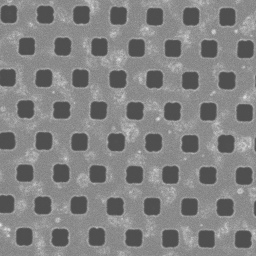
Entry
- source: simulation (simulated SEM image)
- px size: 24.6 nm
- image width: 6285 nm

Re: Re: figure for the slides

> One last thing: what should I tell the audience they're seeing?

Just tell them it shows a regular array of holes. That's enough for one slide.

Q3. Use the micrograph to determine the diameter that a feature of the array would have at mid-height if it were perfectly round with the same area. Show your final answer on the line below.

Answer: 0.469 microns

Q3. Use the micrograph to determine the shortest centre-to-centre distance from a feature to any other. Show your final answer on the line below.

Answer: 884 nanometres